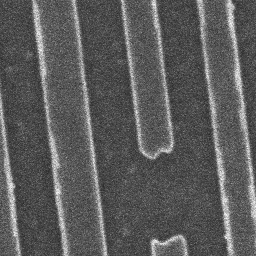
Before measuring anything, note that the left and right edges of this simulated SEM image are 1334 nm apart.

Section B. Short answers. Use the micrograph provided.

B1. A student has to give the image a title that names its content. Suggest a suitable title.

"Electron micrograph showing one or a few lines or trenches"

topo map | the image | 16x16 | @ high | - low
--@@@---@@--@@@-
--@@@---@@---@@-
--@@@---@@---@@-
--@@@---@@---@@-
---@@---@@---@@-
---@@---@@---@@-
---@@---@@@--@@-
---@@@---@@--@@-
---@@@---@@--@@-
---@@@---@----@@
@--@@@--------@@
@--@@@--------@@
@---@@--------@@
@---@@--------@@
@---@@--------@@
@---@@@---@@--@@